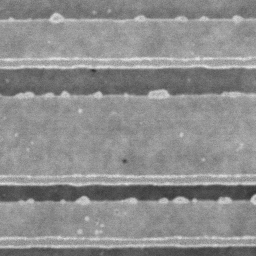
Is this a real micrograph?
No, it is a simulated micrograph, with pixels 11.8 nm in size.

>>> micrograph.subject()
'lines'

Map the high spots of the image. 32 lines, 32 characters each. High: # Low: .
................................
................................
.#.#..##....#...###.####.#######
################################
################################
################################
################################
################################
###....##.....#.................
................................
................................
...................##...........
################################
################################
################################
################################
################################
################################
################################
################################
################################
################################
################################
................................
................................
################################
################################
################################
################################
################################
################################
................................